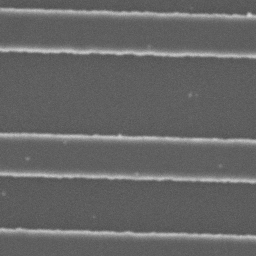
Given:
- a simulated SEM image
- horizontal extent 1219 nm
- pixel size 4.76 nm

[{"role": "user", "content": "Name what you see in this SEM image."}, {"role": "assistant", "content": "lines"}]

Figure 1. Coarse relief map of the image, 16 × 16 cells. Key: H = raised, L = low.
LLLLLLLLLLLLLLLL
HHHHHHHHHHHHHHHH
HHHHHHHHHHHHHHHH
LLLLLLLLLLLLLHHH
LLLLLLLLLLLLLLLL
LLLLLLLLLLLLLLLL
LLLLLLLLLLLLLLLL
LLLLLLLLLLLLLLLL
HHHHHHLLLLLLLLLL
HHHHHHHHHHHHHHHH
HHHHHHHHHHHHHHHH
LLLLLLLLLLLLLLLL
LLLLLLLLLLLLLLLL
LLLLLLLLLLLLLLLL
HHHHHLLLLLLLLLLL
HHHHHHHHHHHHHHHH